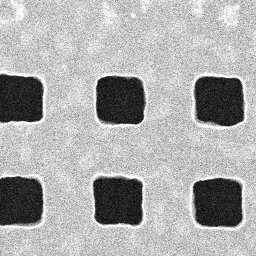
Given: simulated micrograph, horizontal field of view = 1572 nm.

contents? holes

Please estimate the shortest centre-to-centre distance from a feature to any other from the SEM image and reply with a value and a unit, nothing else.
99.5 px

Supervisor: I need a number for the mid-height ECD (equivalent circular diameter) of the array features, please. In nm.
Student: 330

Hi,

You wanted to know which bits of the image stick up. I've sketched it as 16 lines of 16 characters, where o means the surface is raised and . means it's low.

oooooooooooooooo
oooooooooooooooo
oooooooooooooooo
oooooooooooooooo
oooooooooooooooo
...ooo...ooo...o
...ooo...ooo...o
..oooo...ooo...o
oooooooooooooooo
oooooooooooooooo
oooooooooooooooo
..oooo...ooo...o
...ooo...ooo...o
...ooo...ooo...o
oooooooooooooooo
oooooooooooooooo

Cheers